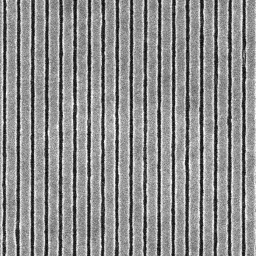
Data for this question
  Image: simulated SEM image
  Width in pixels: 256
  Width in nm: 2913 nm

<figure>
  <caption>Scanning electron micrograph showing parallel lines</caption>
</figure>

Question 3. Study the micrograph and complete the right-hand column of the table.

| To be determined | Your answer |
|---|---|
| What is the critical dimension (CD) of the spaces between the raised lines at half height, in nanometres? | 46.9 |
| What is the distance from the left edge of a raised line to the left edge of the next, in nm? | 160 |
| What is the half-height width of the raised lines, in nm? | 115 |